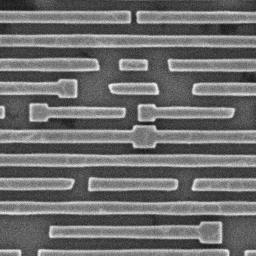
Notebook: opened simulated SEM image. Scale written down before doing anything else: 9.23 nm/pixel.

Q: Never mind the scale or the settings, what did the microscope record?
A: wiring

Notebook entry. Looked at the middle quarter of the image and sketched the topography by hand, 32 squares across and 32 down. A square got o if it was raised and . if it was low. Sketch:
ooooooooo.....ooooooo.....oooooo
oooooo.....................ooooo
................................
................................
ooo.............................
ooo........oooooooooooo.........
ooo.........oooooooooooo........
ooo.............................
................................
................................
...................oooo.........
ooooooooooooooo....ooooooooooooo
ooooooooooooooo....ooooooooooooo
...................oooo.........
................................
................................
.................oooooo.........
oooooooooooooooooooooooooooooooo
oooooooooooooooooooooooooooooooo
oooooooooooooooooooooooooooooooo
.................oooooo.........
................................
................................
oooooooooooooooooooooooooooooooo
oooooooooooooooooooooooooooooooo
ooooo.....................oooooo
................................
................................
................................
oo....oooooooooooooooooooooo....
oo....oooooooooooooooooooooo....
......oooooooooo.........oo.....